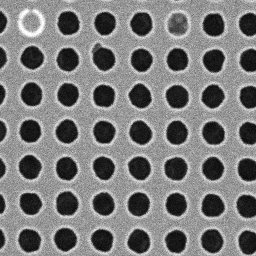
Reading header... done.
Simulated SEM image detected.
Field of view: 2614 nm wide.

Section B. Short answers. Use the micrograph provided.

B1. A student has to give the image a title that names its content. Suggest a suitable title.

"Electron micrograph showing a regular array of holes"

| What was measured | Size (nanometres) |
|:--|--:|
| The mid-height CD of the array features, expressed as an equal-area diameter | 237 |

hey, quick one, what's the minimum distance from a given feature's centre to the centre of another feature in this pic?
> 366 nm